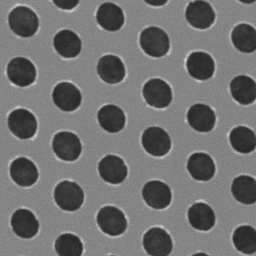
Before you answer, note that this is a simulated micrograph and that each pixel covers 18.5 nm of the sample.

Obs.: a regular array of holes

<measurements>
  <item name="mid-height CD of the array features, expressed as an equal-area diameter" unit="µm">0.549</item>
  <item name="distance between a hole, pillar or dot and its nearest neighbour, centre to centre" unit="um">0.915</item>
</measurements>